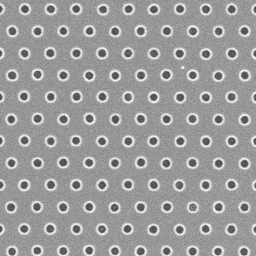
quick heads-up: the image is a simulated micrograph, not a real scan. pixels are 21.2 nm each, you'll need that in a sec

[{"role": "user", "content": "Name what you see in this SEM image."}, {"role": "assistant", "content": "a regular array of holes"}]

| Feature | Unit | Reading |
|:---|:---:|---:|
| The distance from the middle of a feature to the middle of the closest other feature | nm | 528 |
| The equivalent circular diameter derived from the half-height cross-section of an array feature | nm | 188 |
